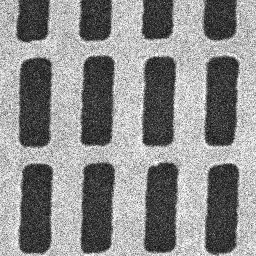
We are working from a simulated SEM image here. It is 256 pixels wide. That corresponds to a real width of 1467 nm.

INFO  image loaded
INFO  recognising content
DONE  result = a regular array of holes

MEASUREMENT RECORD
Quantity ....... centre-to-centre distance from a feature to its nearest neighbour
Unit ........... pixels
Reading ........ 61.4